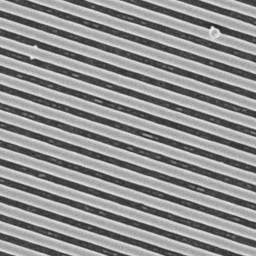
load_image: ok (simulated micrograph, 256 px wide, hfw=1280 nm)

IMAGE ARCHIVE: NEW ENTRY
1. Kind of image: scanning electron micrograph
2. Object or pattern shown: parallel lines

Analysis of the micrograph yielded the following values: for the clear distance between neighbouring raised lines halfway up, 32.7 nm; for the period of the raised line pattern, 88.1 nm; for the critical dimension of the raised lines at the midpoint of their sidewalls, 55.3 nanometers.